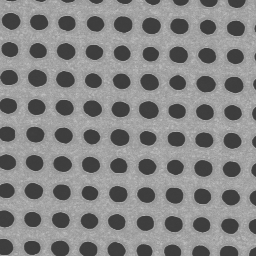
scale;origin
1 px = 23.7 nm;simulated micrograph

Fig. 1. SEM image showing a regular array of holes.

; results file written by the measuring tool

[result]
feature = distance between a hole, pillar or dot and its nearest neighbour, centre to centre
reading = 663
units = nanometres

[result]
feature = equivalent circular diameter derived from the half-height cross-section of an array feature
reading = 397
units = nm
